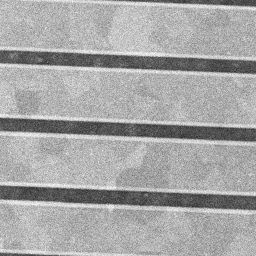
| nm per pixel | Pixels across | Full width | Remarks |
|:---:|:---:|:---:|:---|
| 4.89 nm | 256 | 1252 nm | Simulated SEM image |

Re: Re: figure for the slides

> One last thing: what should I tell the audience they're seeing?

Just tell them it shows one or a few lines or trenches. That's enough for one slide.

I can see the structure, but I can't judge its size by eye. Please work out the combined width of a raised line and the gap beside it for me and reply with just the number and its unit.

331 nanometers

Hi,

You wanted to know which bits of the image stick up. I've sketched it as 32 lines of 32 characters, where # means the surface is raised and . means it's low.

##################..............
################################
################################
################################
################################
################################
............####################
................................
########........................
################################
################################
################################
################################
################################
.###############################
......................##########
................................
#####################...........
################################
################################
################################
################################
################################
............####################
................................
#######.........................
################################
################################
################################
################################
################################
....############################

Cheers